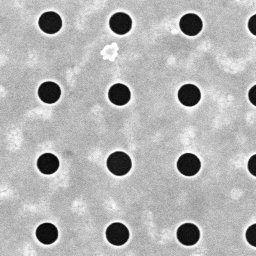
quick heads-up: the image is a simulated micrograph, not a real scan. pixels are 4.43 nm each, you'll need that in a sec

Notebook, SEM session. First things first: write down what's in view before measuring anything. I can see a regular array of holes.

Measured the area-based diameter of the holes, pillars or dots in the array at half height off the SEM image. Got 0.103 um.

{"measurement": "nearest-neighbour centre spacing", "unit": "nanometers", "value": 309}